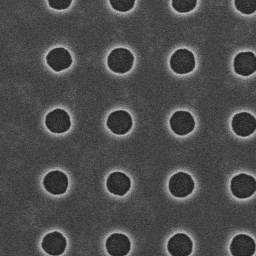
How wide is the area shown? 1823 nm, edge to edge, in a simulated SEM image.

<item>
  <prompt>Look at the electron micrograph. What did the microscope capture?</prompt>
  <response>a regular array of holes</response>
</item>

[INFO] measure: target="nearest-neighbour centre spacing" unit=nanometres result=438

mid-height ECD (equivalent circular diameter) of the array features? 181 nm